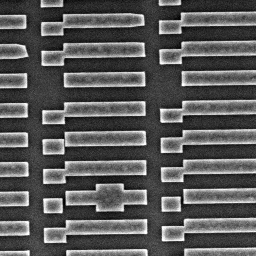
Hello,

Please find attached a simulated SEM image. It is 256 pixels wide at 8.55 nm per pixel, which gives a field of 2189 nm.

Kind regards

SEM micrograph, wiring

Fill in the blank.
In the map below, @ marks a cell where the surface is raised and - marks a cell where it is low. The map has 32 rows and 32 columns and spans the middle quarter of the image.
--------------------------------
--------------------------------
@@@@@@@@@@@@@@@@@@@@----------@@
@@@@@@@@@@@@@@@@@@@@----------@@
@@@@@@@@@@@@@@@@@@@@----------@@
@@@@@@@@@@@@@@@-----------------
--------------------------------
--------------------------------
--------------------------------
------------------------------@@
@@@@@@@@@@@@@@@@@@@@----------@@
@@@@@@@@@@@@@@@@@@@@----@@@@@@@@
@@@@@@@@@@@@@@@@@@@@----@@@@@@@@
------------------------@@@@@@--
--------------------------------
--------------------------------
--------------------------------
@@@@@@@@@@@@@@@@@@@@----------@@
@@@@@@@@@@@@@@@@@@@@------@@@@@@
@@@@@@@@@@@@@@@@@@@@----@@@@@@@@
@@@@--------------------@@@@@@--
------------------------@@@@@@--
--------------------------------
--------------------------------
@@@@@@@@@@@@@@@@@@@@----------@@
@@@@@@@@@@@@@@@@@@@@----------@@
@@@@@@@@@@@@@@@@@@@@----@@@@@@@@
@@@@@@@@@@@@@@@@@@@@----@@@@@@--
------------------------@@@@@@--
--------------------------------
--------@@@@@@@-----------------
--------@@@@@@@---------------@@